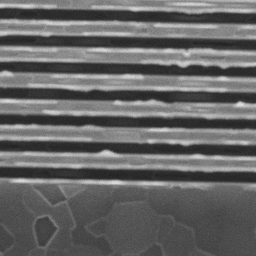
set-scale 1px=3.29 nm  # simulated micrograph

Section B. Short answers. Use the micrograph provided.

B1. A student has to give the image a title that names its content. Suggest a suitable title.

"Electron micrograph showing parallel lines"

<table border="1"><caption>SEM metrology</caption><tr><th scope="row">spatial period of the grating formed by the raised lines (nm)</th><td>86.8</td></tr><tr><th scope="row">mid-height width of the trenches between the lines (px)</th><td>11.5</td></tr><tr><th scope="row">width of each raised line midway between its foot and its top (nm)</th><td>50.1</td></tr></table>